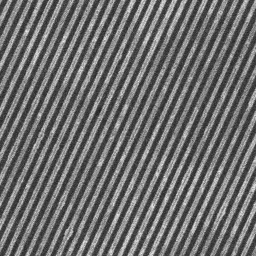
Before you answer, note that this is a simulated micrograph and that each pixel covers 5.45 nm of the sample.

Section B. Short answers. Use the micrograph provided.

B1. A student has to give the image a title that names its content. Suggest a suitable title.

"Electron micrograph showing parallel lines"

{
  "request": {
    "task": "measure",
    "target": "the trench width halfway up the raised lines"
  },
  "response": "29.8 nanometres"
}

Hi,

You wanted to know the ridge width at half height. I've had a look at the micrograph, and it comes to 19.8 nm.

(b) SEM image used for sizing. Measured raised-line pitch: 51 nm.